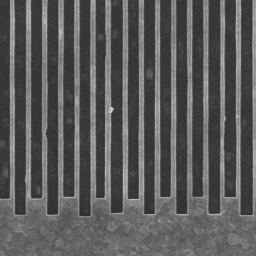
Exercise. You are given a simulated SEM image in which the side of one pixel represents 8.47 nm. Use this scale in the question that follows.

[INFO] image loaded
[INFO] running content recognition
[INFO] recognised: parallel lines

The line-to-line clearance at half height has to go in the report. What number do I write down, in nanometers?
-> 96.3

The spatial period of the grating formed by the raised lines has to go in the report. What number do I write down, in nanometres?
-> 137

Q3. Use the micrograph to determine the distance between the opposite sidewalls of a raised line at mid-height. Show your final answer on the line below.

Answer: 0.0402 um